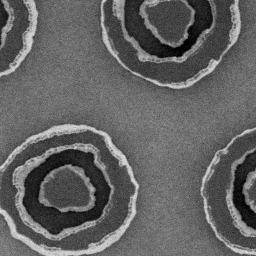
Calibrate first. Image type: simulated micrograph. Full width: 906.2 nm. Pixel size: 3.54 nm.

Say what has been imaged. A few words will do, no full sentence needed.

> ring-shaped raised bodies with a dot in the middle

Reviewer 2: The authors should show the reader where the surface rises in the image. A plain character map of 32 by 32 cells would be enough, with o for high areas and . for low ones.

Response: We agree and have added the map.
.ooo.........oo...ooooo...oooo..
.ooo.........oo...oooooo...ooo..
.ooo.........oo...oooooo...ooo..
.ooo.........ooo...oooo...oooo..
oooo.........ooo....ooo..ooooo..
oooo.........oooo....oo.ooooo...
ooo...........oooo.....ooooo....
ooo............ooooooooooooo....
oo..............ooooooooooo.....
..................ooooooo.......
....................oooo........
................................
................................
................................
................................
................................
......oooooo...................o
....oooooooooo...............ooo
..oooooooooooo..............oooo
.ooooo......ooo............oooo.
.oooo.......oooo..........ooo...
ooo....ooo...ooo..........ooo...
ooo...ooooo..oooo........oooo..o
ooo..oooooo...ooo........oooo..o
ooo..ooooooo..ooo........oooo..o
ooo...ooooo..oooo.........ooo..o
ooo..........oooo.........oooo..
.ooo........oooo..........oooo..
..ooo....ooooooo...........oooo.
..ooooooooooooo............ooooo
....ooooooooo...............oooo
......oooooo...................o